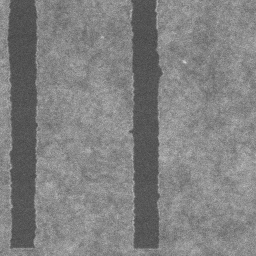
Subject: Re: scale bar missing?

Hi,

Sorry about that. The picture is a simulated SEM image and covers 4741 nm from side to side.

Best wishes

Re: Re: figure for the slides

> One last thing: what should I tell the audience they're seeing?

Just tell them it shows one or a few lines or trenches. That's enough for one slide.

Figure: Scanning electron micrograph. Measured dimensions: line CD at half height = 0.497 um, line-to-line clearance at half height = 1.76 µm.